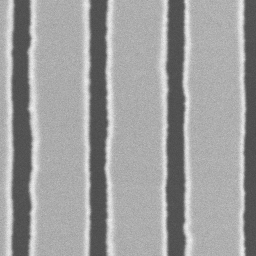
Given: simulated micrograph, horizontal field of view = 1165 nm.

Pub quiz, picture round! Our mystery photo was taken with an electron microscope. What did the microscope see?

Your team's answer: lines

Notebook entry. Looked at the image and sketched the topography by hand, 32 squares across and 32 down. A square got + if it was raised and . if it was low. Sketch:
++..+++++++..++++++++..+++++++..
++..+++++++..++++++++..+++++++..
++..+++++++..++++++++..+++++++..
++..+++++++..++++++++..+++++++..
++..+++++++..++++++++..+++++++..
++..+++++++..++++++++..+++++++..
++.++++++++..++++++++..++++++++.
++..+++++++..++++++++..++++++++.
++..+++++++..++++++++..+++++++..
++..+++++++..++++++++..+++++++..
+...+++++++..++++++++..++++++++.
+...+++++++..++++++++..++++++++.
++..+++++++..++++++++..++++++++.
++..+++++++..++++++++..++++++++.
++..+++++++..++++++++..++++++++.
++..+++++++..++++++++..++++++++.
++..+++++++..++++++++..++++++++.
++..+++++++..++++++++..+++++++..
++..+++++++..++++++++..+++++++..
++..+++++++..++++++++..+++++++..
++..+++++++..++++++++..+++++++..
++..+++++++..++++++++..+++++++..
++..+++++++..++++++++..+++++++..
+...+++++++..++++++++..+++++++..
++..+++++++..++++++++..++++++++.
++..+++++++..++++++++..+++++++..
++..+++++++..++++++++..+++++++..
++..+++++++..++++++++..+++++++..
++..+++++++..++++++++..+++++++..
++..+++++++..++++++++..+++++++..
+...+++++++..++++++++..+++++++..
++..+++++++..++++++++..++++++++.